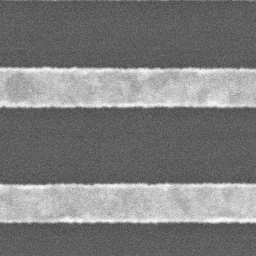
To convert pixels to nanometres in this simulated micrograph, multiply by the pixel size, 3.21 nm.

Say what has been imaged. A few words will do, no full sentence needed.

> lines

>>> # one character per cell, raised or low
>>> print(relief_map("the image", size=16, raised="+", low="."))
................
................
................
................
++++++++++++++++
++++++++++++++++
++++++++++++++++
................
................
................
................
................
++++++++++++++++
++++++++++++++++
................
................